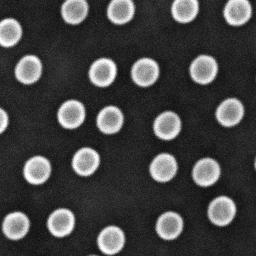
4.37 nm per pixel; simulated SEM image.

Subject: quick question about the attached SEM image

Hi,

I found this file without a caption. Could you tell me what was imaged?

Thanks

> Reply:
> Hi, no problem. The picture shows a regular array of raised bodies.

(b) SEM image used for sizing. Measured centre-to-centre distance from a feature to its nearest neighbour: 45.5 pixels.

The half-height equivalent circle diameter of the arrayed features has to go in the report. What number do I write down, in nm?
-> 112